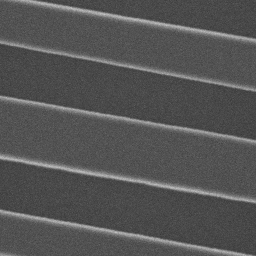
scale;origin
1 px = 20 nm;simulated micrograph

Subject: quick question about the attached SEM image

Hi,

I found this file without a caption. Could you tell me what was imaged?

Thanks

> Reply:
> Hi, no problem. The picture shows lines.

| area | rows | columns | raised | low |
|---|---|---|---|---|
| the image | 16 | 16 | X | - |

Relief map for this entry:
XXXXX-----------
XXXXXXXXXX------
XXXXXXXXXXXXXXXX
----XXXXXXXXXXXX
----------XXXXXX
---------------X
XXX-------------
XXXXXXXXX-------
XXXXXXXXXXXXXX--
XXXXXXXXXXXXXXXX
----XXXXXXXXXXXX
----------XXXXXX
---------------X
XX--------------
XXXXXXX---------
XXXXXXXXXXXXX---